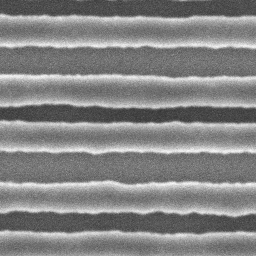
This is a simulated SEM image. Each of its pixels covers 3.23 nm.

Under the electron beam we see lines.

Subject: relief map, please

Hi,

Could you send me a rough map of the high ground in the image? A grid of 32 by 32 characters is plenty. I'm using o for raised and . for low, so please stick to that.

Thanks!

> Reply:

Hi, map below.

................................
................................
oooooooooooooooooooooooooooooooo
oooooooooooooooooooooooooooooooo
oooooooooooooooooooooooooooooooo
oooooooooooooooooooooooooooooooo
................................
................................
................................
oooo.ooooo.ooooo................
oooooooooooooooooooooooooooooooo
oooooooooooooooooooooooooooooooo
oooooooooooooooooooooooooooooooo
...................o............
................................
oooooooooooo..ooo.ooooo.oo......
oooooooooooooooooooooooooooooooo
oooooooooooooooooooooooooooooooo
oooooooooooooooooooooooooooooooo
................................
................................
................................
................................
oooooooooooooooooooooooooooooooo
oooooooooooooooooooooooooooooooo
oooooooooooooooooooooooooooooooo
o......oo.ooooo..oo..ooooooooooo
................................
................................
oooooooooooooooooooooooooooooooo
oooooooooooooooooooooooooooooooo
oooooooooooooooooooooooooooooooo